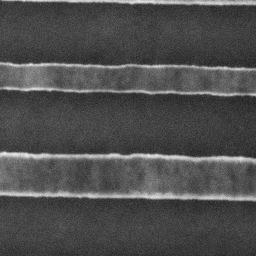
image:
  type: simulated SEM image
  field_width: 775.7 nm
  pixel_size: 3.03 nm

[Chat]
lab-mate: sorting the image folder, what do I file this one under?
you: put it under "lines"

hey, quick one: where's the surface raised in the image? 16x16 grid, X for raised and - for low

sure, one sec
----------------
----------------
----------------
----------------
XXXXXXXXXXXXXXXX
XXXXXXXXXXXXXXXX
----------------
----------------
----------------
----------------
XXXXXXXXXXXXXXXX
XXXXXXXXXXXXXXXX
----------------
----------------
----------------
----------------